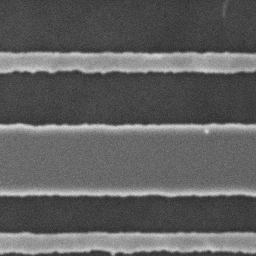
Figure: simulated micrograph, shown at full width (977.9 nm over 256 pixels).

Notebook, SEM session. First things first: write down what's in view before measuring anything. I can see lines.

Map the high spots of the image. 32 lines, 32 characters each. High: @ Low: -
--------------------------------
--------------------------------
--------------------------------
--------------------------------
--------------------------------
--------------------------------
--------------------------------
@@@@@@@@@@@@@@@@@@@@@@@@@@@@@@@@
@@@@@@@@@@@@@@@@@@@@@@@@@@@@@@@@
--------------------------------
--------------------------------
--------------------------------
--------------------------------
--------------------------------
--------------------------------
--------------------------------
@@@@@@@@@@@@@@@@@@@@@@@@@@@@@@@@
@@@@@@@@@@@@@@@@@@@@@@@@@@@@@@@@
@@@@@@@@@@@@@@@@@@@@@@@@@@@@@@@@
@@@@@@@@@@@@@@@@@@@@@@@@@@@@@@@@
@@@@@@@@@@@@@@@@@@@@@@@@@@@@@@@@
@@@@@@@@@@@@@@@@@@@@@@@@@@@@@@@@
@@@@@@@@@@@@@@@@@@@@@@@@@@@@@@@@
@@@@@@@@@@@@@@@@@@@@@@@@@@@@@@@@
--@------------@-----@---@-----@
--------------------------------
--------------------------------
--------------------------------
--------------------------------
@@@@@@@@@@@@@@@@@@@@@@@@@@@@@@@@
@@@@@@@@@@@@@@@@@@@@@@@@@@@@@@@@
---@@---------------------------